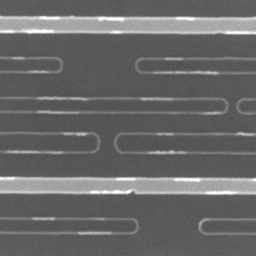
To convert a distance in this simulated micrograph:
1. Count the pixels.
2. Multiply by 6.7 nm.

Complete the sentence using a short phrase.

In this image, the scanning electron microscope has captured parallel lines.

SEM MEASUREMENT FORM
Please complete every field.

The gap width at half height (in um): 0.165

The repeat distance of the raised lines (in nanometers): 270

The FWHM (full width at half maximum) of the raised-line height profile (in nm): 107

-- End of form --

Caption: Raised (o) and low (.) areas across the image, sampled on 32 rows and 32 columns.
................................
................................
oooooooooooooooooooooooooooooooo
oooooooooooooooooooooooooooooooo
................................
................................
................................
ooooooo..........ooooooooooooooo
oooooooo.........ooooooooooooooo
................................
................................
................................
oooooooooooooooooooooooooooo..oo
oooooooooooooooooooooooooooo..oo
................................
................................
................................
oooooooooooo..oooooooooooooooooo
oooooooooooo..oooooooooooooooooo
................................
................................
................................
oooooooooooooooooooooooooooooooo
oooooooooooooooooooooooooooooooo
................................
................................
................................
ooooooooooooooooo........ooooooo
ooooooooooooooooo........ooooooo
................................
................................
................................